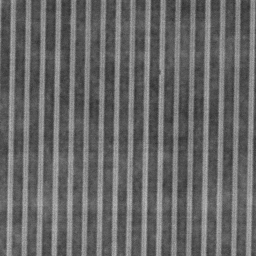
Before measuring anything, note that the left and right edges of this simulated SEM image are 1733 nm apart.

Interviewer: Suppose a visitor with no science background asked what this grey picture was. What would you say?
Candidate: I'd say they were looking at parallel lines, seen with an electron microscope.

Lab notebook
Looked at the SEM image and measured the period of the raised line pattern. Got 14.9 px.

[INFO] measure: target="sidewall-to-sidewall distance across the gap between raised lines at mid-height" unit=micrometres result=0.0786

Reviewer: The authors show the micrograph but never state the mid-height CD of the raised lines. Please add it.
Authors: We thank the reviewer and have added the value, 24.5 nanometers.